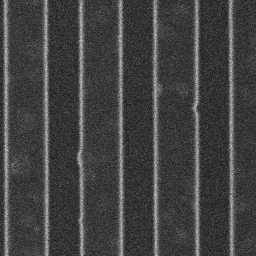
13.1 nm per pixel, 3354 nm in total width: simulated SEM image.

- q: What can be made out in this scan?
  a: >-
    one or a few lines or trenches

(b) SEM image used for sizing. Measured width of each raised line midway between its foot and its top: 544 nm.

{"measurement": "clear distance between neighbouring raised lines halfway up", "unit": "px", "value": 33.8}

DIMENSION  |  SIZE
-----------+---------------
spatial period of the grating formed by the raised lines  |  983 nm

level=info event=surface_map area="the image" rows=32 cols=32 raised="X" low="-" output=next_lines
-XXXXX----XXXXX----XXXXXX----XXX
-XXXXX----XXXXX----XXXXXX----XXX
-XXXXX----XXXXX----XXXXXX----XXX
-XXXXX----XXXXX----XXXXXX----XXX
-XXXXX----XXXXX----XXXXXX----XXX
-XXXXX----XXXXX----XXXXXX----XXX
-XXXXX----XXXXX----XXXXXX----XXX
-XXXXX----XXXXX----XXXXXX----XXX
-XXXXX----XXXXX----XXXXXX----XXX
-XXXXX----XXXXX----XXXXXX----XXX
-XXXXX----XXXXX----XXXXXX----XXX
-XXXXX----XXXXX----XXXXXX----XXX
-XXXXX----XXXXX----XXXXXX----XXX
-XXXXX----XXXXX----XXXXX-----XXX
-XXXXX----XXXXX----XXXXXX----XXX
-XXXXX----XXXXX----XXXXXX----XXX
-XXXXX----XXXXX----XXXXXX----XXX
-XXXXX----XXXXX----XXXXXX----XXX
-XXXXX----XXXXX----XXXXXX----XXX
-XXXXX----XXXXX----XXXXXX----XXX
-XXXXX----XXXXX----XXXXXX----XXX
-XXXXX----XXXXX----XXXXXX----XXX
-XXXXX----XXXXX-----XXXXX----XXX
-XXXXX----XXXXX-----XXXXX----XXX
-XXXXX----XXXXX-----XXXXX----XXX
-XXXXX----XXXXX-----XXXXX----XXX
-XXXXX----XXXXX-----XXXXX----XXX
-XXXXX----XXXXX-----XXXXX----XXX
-XXXXX----XXXXX-----XXXXX----XXX
-XXXXX----XXXXX-----XXXXX----XXX
-XXXXX----XXXXX-----XXXXX----XXX
-XXXXX----XXXXX-----XXXXX----XXX